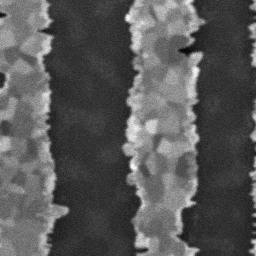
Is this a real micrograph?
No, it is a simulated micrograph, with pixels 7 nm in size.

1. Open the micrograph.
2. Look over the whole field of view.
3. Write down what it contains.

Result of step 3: one or a few lines or trenches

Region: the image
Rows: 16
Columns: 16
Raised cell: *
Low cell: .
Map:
***.....****....
***.....****....
***......***....
***.....****....
***......***....
***.....****....
***.....****....
***.....****....
***.....****....
***.....****....
***.....****....
***.....****....
***......***....
****....***.....
***......**.....
***......***....